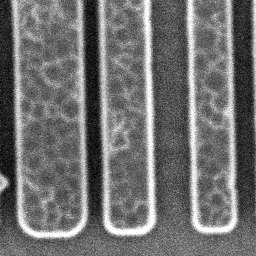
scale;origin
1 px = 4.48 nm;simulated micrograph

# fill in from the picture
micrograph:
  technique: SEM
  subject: one or a few lines or trenches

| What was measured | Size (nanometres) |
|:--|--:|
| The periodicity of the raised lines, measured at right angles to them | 362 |